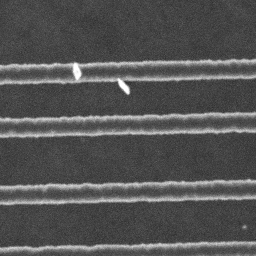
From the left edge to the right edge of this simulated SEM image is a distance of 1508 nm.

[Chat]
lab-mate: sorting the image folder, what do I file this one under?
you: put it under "lines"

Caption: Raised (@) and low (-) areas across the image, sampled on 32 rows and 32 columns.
--------------------------------
--------------------------------
--------------------------------
--------------------------------
--------------------------------
--------------------------------
--------------------------------
--------------------------------
@@@@@@@@@@@@@@@@@@@@@@@@@@@@@@@@
@@@@@@@@@@@@@@@@@@@@@@@@@@@@@@@@
---------------@----------------
--------------------------------
--------------------------------
--------------------------------
------------------@@-@@@@@@@@@@@
@@@@@@@@@@@@@@@@@@@@@@@@@@@@@@@@
@@@@@@@@@@@@@@@@@@@@@@----------
--------------------------------
--------------------------------
--------------------------------
--------------------------------
--------------------------------
--------------------------------
@@@@@@@@@@@@@@@@@@@@@@@@@@@@@@@@
@@@@@@@@@@@@@@@@@@@@@@@@@@@@@@@@
--------------------------------
--------------------------------
--------------------------------
--------------------------------
--------------------------------
------------------------@@@@@@@@
@@@@@@@@@@@@@@@@@@@@@@@@@@@@@@@@